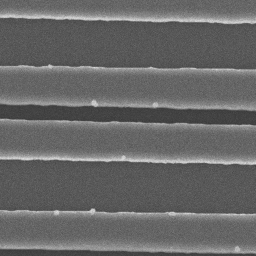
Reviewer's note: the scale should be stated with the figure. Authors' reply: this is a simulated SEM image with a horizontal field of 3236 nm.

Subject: lines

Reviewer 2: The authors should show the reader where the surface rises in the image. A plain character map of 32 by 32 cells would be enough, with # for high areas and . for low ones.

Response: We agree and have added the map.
################################
################################
.................###############
................................
................................
................................
................................
................................
#############.....#.............
################################
################################
################################
################################
.....................###########
................................
########################........
################################
################################
################################
################################
............................#.##
................................
................................
................................
................................
................................
############....................
################################
################################
################################
################################
......................##########